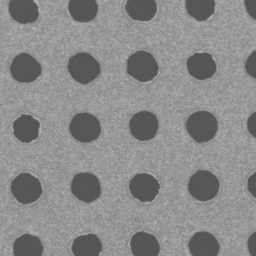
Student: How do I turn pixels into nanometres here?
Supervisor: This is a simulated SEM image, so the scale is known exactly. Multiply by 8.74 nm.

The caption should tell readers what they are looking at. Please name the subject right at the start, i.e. a regular array of holes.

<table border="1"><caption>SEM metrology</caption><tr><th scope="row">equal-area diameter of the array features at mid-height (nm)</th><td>266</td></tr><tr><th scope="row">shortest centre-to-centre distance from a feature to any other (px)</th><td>58.7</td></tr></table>